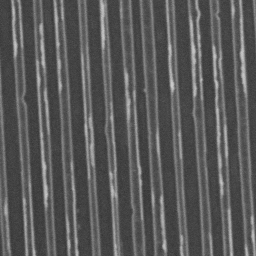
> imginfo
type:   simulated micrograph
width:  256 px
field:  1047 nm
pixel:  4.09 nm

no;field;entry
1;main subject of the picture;parallel lines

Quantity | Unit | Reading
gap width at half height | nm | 55.1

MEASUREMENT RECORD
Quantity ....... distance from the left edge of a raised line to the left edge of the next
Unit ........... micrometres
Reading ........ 0.09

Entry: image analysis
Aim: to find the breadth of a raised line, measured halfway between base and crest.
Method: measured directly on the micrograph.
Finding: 34.7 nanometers